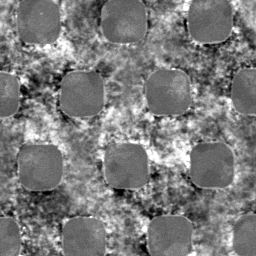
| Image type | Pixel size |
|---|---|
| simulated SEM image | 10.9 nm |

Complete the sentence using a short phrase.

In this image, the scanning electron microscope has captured raised bodies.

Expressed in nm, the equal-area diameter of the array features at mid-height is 534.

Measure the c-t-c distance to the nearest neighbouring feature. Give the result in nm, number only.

921